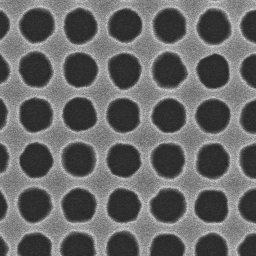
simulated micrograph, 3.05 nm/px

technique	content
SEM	a regular array of holes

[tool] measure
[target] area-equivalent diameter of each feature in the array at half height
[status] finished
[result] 102 nm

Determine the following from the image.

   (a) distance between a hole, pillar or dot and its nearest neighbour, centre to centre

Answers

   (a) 44.1 px